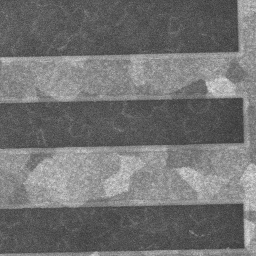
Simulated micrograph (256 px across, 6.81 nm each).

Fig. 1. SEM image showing one or a few lines or trenches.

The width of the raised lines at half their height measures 381 nm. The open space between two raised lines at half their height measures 328 nanometres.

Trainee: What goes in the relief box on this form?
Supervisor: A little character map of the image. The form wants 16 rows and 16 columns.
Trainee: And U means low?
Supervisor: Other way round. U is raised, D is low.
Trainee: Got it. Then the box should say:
DDDDDDDDDDDDDDDU
DDDDDDDDDDDDDDDU
DDDDDDDDDDDDDDDU
DDDDDDDDDDUUUUUU
UUUUUUUUUUUUUUUU
UUUUUUUUUUUUUUUU
DDDDDDDDDDDDDDDU
DDDDDDDDDDDDDDDU
DDDDDDDDDDDDDDDU
UUUUUUUUUUUUUUUU
UUUUUUUUUUUUUUUU
UUUUUUUUUUUUUUUU
UUUUUUUUUUUUUUUU
DDDDDDDDDDDDDDDU
DDDDDDDDDDDDDDDU
DDDDDDDDDDDDDDDU